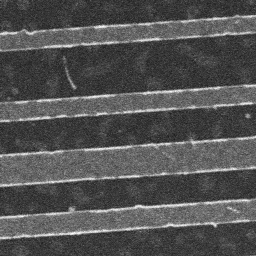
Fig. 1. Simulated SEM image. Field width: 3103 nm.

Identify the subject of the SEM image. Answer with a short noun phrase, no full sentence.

one or a few lines or trenches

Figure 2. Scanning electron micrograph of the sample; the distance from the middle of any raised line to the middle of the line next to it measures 748 nm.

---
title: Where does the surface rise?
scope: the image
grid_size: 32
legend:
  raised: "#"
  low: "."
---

................................
................................
.........................#######
..........######################
##########################......
#############...................
................................
................................
................................
................................
................................
...................#############
.....###########################
#######################.........
##########......................
................................
................................
...........................#####
.............###################
################################
################################
#########################.......
##########......................
................................
................................
.......................#########
........########################
################################
###################.............
#####...........................
................................
................................